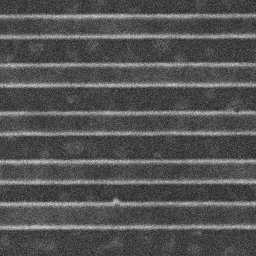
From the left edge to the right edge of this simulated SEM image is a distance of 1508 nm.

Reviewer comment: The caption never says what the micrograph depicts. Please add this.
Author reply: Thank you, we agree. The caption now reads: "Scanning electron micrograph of parallel lines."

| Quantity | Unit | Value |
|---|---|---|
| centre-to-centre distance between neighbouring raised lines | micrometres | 0.278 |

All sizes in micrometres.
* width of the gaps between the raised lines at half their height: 0.158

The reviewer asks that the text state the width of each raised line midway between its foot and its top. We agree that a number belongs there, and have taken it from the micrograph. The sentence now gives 0.129 micrometres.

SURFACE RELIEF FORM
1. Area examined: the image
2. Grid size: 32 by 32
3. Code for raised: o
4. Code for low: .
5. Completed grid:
................................
................................
oooooooooooooooooooooooooooooooo
oooooooooooooooooooooooooooooooo
oooooooooooooooooooooooooooooooo
................................
................................
................................
oooooooooooooooooooooooooooooooo
oooooooooooooooooooooooooooooooo
oooooooooooooooooooooooooooooooo
................................
................................
................................
oooooooooooooooooooooooooooooooo
oooooooooooooooooooooooooooooooo
oooooooooooooooooooooooooooooooo
................................
................................
................................
oooooooooooooooooooooooooooooooo
oooooooooooooooooooooooooooooooo
oooooooooooooooooooooooooooooooo
................................
................................
ooooooooooooooooooooooooooooo.oo
oooooooooooooooooooooooooooooooo
oooooooooooooooooooooooooooooooo
.oo.............................
................................
................................
................................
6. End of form